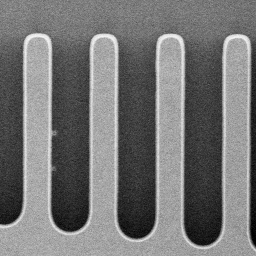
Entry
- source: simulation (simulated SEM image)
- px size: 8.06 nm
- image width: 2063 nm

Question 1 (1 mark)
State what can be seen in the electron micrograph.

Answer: groups of lines, slits or small figures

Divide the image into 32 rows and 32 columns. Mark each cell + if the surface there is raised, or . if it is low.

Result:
................................
................................
................................
................................
....++......++.......+..........
...+++.....++++.....+++.....+++.
...+++.....++++.....+++.....+++.
...+++.....++++.....+++.....+++.
...+++.....++++.....+++.....+++.
...+++.....++++.....+++.....+++.
...+++.....++++.....+++.....+++.
...+++.....++++.....+++.....+++.
...+++.....++++.....+++.....+++.
...+++.....++++.....+++.....+++.
...+++.....++++.....+++.....+++.
...+++.....++++.....+++.....+++.
...+++.....++++.....+++.....+++.
...+++.....++++.....+++.....+++.
...+++.....++++.....+++.....+++.
...+++.....++++.....+++.....+++.
...+++.....++++.....+++.....+++.
...+++.....++++.....+++.....+++.
...+++.....++++.....+++.....+++.
...+++.....++++.....+++.....+++.
...+++.....++++.....+++.....+++.
...+++.....++++.....+++.....+++.
...+++.....++++.....+++.....+++.
..+++++....++++.....+++.....+++.
+++++++...+++++....++++.....+++.
++++++++++++++++..+++++....++++.
++++++++++++++++++++++++...+++++
++++++++++++++++++++++++++++++++